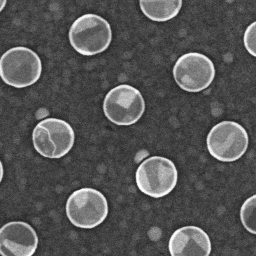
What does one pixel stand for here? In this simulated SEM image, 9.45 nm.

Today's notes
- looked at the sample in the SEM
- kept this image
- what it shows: raised bodies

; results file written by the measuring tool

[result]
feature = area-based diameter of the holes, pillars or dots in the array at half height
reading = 0.365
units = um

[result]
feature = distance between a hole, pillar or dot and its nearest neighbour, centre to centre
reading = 723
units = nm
